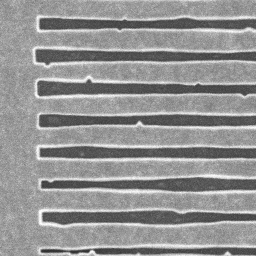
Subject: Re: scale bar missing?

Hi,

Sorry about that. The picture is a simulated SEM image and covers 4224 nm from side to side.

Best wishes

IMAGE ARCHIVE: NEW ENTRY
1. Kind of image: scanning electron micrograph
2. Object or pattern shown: parallel lines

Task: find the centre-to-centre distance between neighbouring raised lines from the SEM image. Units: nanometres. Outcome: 538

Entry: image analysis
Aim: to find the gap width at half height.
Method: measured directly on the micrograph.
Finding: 10.9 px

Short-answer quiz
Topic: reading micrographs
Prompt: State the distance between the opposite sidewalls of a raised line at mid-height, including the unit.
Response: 342 nanometres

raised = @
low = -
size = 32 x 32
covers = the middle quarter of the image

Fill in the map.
@@@@@@@@@@@@@@@@@@@@@@@@@@@@@@@@
@@@@@@@@@@@@@@@@@@@@@@@@@@@@@@@@
@@@@@@@@@@@@@@@@@@@@@@@@@@@@@@@@
@@@@@@@@@@@@@@@@@@@@@@@@@@@@@@@@
-------@@@@@@@@@@@@@@@@@@@@@@@@@
--------------------------------
--------------------------------
----------------------@---------
@@@@@@@@@@@@@@@@@@@@@@@@@@@@@@@@
@@@@@@@@@@@@@@@@@@@@@@@@@@@@@@@@
@@@@@@@@@@@@@@@@@@@@@@@@@@@@@@@@
@@@@@@@@@@@@@@@@@@@@@@@@@@@@@@@@
@@@@@@@@@@@@@@@@@@@@@@@---------
--------------------------------
--------------------------------
----@@@@@@@@@@@@@@@@@@@---------
@@@@@@@@@@@@@@@@@@@@@@@@@@@@@@@@
@@@@@@@@@@@@@@@@@@@@@@@@@@@@@@@@
@@@@@@@@@@@@@@@@@@@@@@@@@@@@@@@@
@@@@@@@@@@@@@@@@@@@@@@@@@@@@@@@@
--------@@@@@@@@@@@@@@@@@@@@@@@@
--------------------------------
--------------------------------
--------------------------------
@@@@@@@@@@@@@@@@@@@@@@@@@@@@@@@@
@@@@@@@@@@@@@@@@@@@@@@@@@@@@@@@@
@@@@@@@@@@@@@@@@@@@@@@@@@@@@@@@@
@@@@@@@@@@@@@@@@@@@@@@@@@@@@@@@@
@@@@@@@@@@@@@@@@@@@@@@@@--------
--------------------------------
--------------------------------
@@@@@@@@@@----------------------